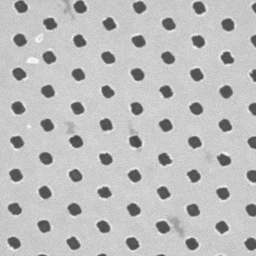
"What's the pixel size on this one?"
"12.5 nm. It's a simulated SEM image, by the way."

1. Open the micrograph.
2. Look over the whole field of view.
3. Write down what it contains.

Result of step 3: a regular array of holes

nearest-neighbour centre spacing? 418 nm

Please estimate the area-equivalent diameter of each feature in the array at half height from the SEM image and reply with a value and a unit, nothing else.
167 nm